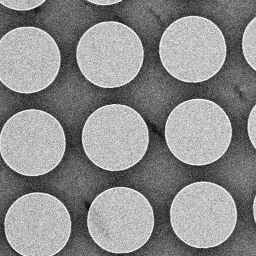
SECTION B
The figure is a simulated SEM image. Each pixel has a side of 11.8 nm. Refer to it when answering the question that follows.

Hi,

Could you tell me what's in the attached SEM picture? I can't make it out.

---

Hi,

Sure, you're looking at an array of small figures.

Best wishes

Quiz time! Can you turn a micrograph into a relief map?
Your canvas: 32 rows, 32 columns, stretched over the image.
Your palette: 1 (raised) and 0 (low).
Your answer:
11111000000011000000000000000000
00000000000000000000000000000000
00000000000000000000001111000000
00110000000111110000011111100001
01111100001111111000111111110011
11111110001111111100111111110011
11111110001111111100111111110011
11111111001111111100111111110001
11111110001111111100011111100000
11111110000111111000001111100000
01111100000011110000000000000000
00110000000000000000000000000000
00000000000000000000000011000000
00000000000001110000001111110000
00111100000111111100011111110001
01111110000111111100011111111001
11111111001111111100011111111001
11111111001111111110011111111001
11111111000111111100011111110000
11111111000111111100001111110000
01111110000011111000000011000000
00111100000000000000000000000000
00000000000000000000000000000000
00000000000000110000000111110000
00011100000011111100001111111000
00111111000111111110001111111000
01111111000111111110011111111100
01111111100111111110011111111000
01111111100111111110001111111000
01111111100111111110001111111000
01111111000011111100000111100000
00111110000000110000000000000000